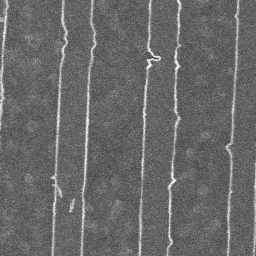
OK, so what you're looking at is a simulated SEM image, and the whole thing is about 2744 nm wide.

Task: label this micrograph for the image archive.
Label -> one or a few lines or trenches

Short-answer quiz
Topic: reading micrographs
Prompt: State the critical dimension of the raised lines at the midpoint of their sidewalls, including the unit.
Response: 29.9 pixels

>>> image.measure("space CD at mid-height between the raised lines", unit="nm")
612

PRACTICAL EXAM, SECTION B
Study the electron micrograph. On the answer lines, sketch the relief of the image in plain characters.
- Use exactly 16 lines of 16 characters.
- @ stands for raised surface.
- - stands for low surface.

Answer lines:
----@@---@@----@
----@@---@@----@
----@@---@@----@
----@@---@@----@
----@@---@@----@
----@@---@@----@
----@@---@@----@
----@@---@@----@
----@----@@---@@
----@----@@---@@
---@@----@@---@@
---@@----@@---@@
---@@----@@---@@
---@@----@@---@@
---@@----@@---@@
---@@----@@---@@